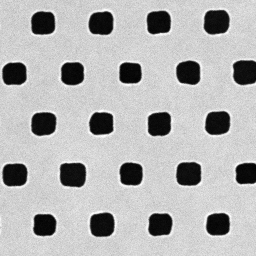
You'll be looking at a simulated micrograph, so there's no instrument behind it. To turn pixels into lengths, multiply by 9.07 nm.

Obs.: a regular array of holes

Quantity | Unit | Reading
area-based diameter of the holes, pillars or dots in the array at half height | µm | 0.233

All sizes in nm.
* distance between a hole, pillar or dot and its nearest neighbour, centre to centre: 524